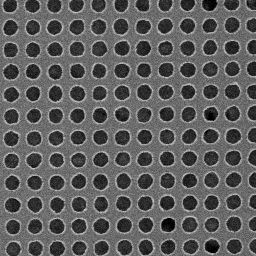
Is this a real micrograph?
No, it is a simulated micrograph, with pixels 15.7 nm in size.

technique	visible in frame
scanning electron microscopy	a regular array of holes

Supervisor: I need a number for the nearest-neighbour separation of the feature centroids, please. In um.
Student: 0.339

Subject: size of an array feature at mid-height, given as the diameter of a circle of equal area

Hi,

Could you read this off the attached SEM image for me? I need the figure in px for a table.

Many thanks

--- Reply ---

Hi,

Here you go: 15.4